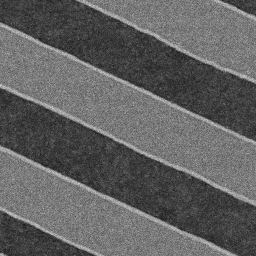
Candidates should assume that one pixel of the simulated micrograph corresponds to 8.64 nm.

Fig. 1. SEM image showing one or a few lines or trenches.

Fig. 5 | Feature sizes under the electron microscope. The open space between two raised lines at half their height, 487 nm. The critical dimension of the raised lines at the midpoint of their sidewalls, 476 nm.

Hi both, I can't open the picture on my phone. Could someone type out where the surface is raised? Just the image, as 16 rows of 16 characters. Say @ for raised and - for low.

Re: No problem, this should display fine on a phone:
------@@@@@@@@@-
--------@@@@@@@@
@@--------@@@@@@
@@@@--------@@@@
@@@@@@--------@@
@@@@@@@@@-------
---@@@@@@@@-----
-----@@@@@@@@---
-------@@@@@@@@-
@--------@@@@@@@
@@@--------@@@@@
@@@@@--------@@@
@@@@@@@--------@
-@@@@@@@@-------
---@@@@@@@@-----
-----@@@@@@@@@--